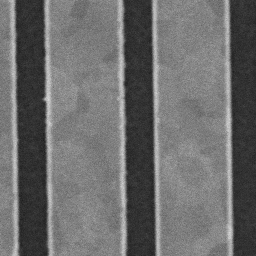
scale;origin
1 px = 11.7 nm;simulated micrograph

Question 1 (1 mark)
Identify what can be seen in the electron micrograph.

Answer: one or a few lines or trenches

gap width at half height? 403 nm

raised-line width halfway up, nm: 849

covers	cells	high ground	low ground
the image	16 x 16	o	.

o..ooooo..oooo..
o..ooooo..oooo..
o..ooooo..oooo..
o..ooooo..oooo..
o..ooooo..oooo..
o..ooooo..oooo..
o..ooooo..oooo..
o..ooooo..oooo..
o..ooooo..oooo..
o..ooooo..oooo..
o..ooooo..oooo..
o..ooooo..oooo..
o..ooooo..oooo..
o..ooooo..oooo..
o..ooooo..oooo..
o..ooooo..oooo..